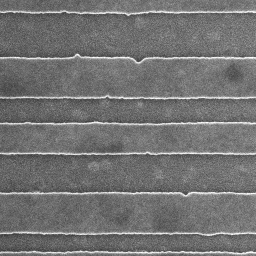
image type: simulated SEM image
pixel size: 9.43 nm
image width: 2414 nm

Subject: one or a few lines or trenches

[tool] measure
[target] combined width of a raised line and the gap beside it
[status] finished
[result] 639 nm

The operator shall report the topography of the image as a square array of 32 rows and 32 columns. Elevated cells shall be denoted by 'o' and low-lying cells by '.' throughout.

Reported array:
oooooooooooooooooooooooooooooooo
oo.oooooooooooooooo.ooooooooo...
................................
................................
................................
................................
................................
ooooooooooooooooo.oooooooooooooo
oooooooooooooooooooooooooooooooo
oooooooooooooooooooooooooooooooo
oooooooooooooooooooooooooooooooo
oooooooooooooooooooooooooooooooo
................................
................................
................................
ooooooooooooooooo.o.oooooooooooo
oooooooooooooooooooooooooooooooo
oooooooooooooooooooooooooooooooo
oooooooooooooooooooooooooooooooo
................................
................................
................................
................................
................................
oooooooooooooooooooooooooooooooo
oooooooooooooooooooooooooooooooo
oooooooooooooooooooooooooooooooo
oooooooooooooooooooooooooooooooo
oooooooooooooooooooooooooooooooo
................................
................................
...oo....oooo........oo...o.....